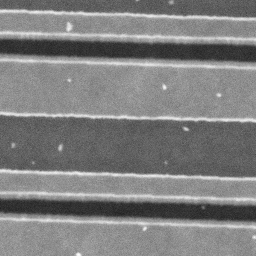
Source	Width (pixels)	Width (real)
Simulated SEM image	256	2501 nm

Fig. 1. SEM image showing lines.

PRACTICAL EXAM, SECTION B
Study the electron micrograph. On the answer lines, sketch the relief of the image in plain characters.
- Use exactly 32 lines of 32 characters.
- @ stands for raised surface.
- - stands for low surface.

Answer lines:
--------------------------------
@@@@@---------------------------
@@@@@@@@@@@@@@@@@@@@@@@@@@@@@@@@
@@@@@@@@@@@@@@@@@@@@@@@@@@@@@@@@
---------@@@@@@@@@@@@@@@@@@@@@@@
--------------------------------
--------------------------------
@@------------------------------
@@@@@@@@@@@@@@@@@@@@@@@@@@@@@@@@
@@@@@@@@@@@@@@@@@@@@@@@@@@@@@@@@
@@@@@@@@@@@@@@@@@@@@@@@@@@@@@@@@
@@@@@@@@@@@@@@@@@@@@@@@@@@@@@@@@
@@@@@@@@@@@@@@@@@@@@@@@@@@@@@@@@
@@@@@@@@@@@@@@@@@@@@@@@@@@@@@@@@
-----------@@@@@@@@@@@@@@@@@@@@@
--------------------------------
--------------------------------
--------------------------------
--------------------------------
--------------------------------
--------------------------------
@@@-----------------------------
@@@@@@@@@@@@@@@@@@@@@@@@@@@@@@@@
@@@@@@@@@@@@@@@@@@@@@@@@@@@@@@@@
--------------@@@@@@@@@@@@@@@@@@
--------------------------------
--------------------------------
@@@@@@@@@-----------------------
@@@@@@@@@@@@@@@@@@@@@@@@@@@@@@@@
@@@@@@@@@@@@@@@@@@@@@@@@@@@@@@@@
@@@@@@@@@@@@@@@@@@@@@@@@@@@@@@@@
@@@@@@@@@@@@@@@@@@@@@@@@@@@@@@@@